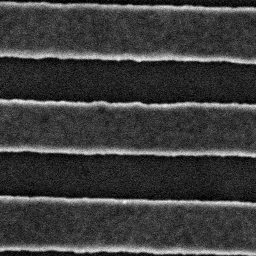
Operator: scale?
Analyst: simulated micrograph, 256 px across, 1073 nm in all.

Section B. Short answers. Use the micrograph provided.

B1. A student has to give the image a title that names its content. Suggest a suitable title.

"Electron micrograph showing lines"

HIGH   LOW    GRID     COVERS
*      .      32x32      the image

******..........................
********************************
********************************
********************************
********************************
********************************
********************************
.................***..**********
................................
................................
................................
................................
**..............................
********************************
********************************
********************************
********************************
********************************
********************************
..............................**
................................
................................
................................
................................
................................
********************************
********************************
********************************
********************************
********************************
********************************
..........*.......**************